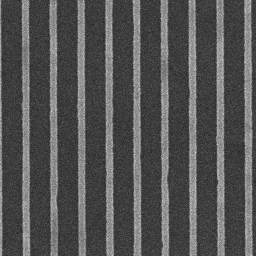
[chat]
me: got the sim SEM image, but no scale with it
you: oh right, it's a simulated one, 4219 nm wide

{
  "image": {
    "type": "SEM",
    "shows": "parallel lines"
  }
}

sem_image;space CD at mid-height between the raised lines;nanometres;348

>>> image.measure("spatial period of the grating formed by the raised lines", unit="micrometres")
0.458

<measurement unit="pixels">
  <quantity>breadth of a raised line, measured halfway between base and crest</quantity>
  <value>6.38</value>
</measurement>